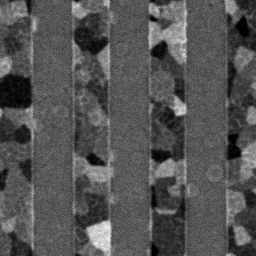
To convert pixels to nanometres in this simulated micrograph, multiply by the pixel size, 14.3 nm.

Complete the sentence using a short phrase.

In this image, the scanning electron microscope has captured one or a few lines or trenches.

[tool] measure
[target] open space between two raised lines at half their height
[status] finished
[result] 40.8 px